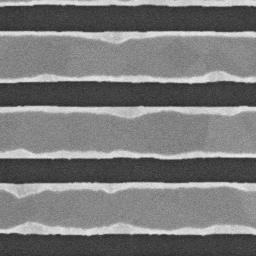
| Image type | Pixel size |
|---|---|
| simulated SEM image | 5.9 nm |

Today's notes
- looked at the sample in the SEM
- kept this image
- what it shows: lines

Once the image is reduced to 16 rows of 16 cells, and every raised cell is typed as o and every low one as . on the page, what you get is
................
................
oooooooooooooooo
oooooooooooooooo
oooooooooooooooo
................
................
oooooooooooooooo
oooooooooooooooo
oooooooooooooooo
................
.............o..
oooooooooooooooo
oooooooooooooooo
.....o...oooo...
................